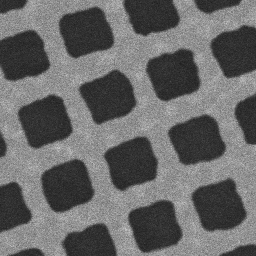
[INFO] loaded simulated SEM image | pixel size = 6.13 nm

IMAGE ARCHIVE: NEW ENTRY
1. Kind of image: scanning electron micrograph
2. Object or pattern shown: a regular array of holes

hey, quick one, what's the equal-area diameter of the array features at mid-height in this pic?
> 315 nanometers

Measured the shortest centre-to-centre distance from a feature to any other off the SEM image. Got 0.415 µm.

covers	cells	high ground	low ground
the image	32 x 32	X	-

---XXXXXXXXXXXX-------XX------XX
-XXXXXXXX----XXX------XXX--XXXXX
XXXXXXXX-----XXX------XXXXXXXXXX
XXXXXXX-------XXX-----XXXXXXXX--
X----XXX------XXXXXXXXXXXXX-----
-----XXX------XXXXXXXXXXXX------
------XX----XXXXXXXXXX--XXX-----
------XXXXXXXXXXXXX-----XXX-----
------XXXXXXXXXXXX-------XXX----
X---XXXXXXXXX---XXX------XXX--XX
XXXXXXXXXX------XXX------XXXXXXX
XXXXXXXXXX-------XX-----XXXXXXXX
XXXXX---XX-------XXX-XXXXXXXXX--
XXX-----XXX------XXXXXXXXXXXX---
XX-------XX-----XXXXXXXXX-XXX---
XXX------XXXXXXXXXXXXX-----XXX--
XXX------XXXXXXXXXXXX------XXX--
-XX-----XXXXXXXX---XX-------XXX-
-XXX-XXXXXXXXX-----XXX------XXXX
XXXXXXXXXXXXX------XXX------XXXX
XXXXXXXX---XX-------XXX-XXXXXXXX
XXXXXX-----XXX------XXXXXXXXXXXX
XXXXX------XXX-----XXXXXXXXX-XXX
---XX-------XXX-XXXXXXXXX-----XX
---XXX------XXXXXXXXXXXX------XX
---XXX----XXXXXXXXX---XX------XX
----XXX-XXXXXXXX------XXX------X
----XXXXXXXXXXXX------XXX-----XX
--XXXXXXXXX--XXX-------XX----XXX
XXXXXXXX------XXX------XXXXXXXXX
XXXXXXXX------XXX-----XXXXXXXXXX
XX---XXX-------XXX-XXXXXXXXXX---